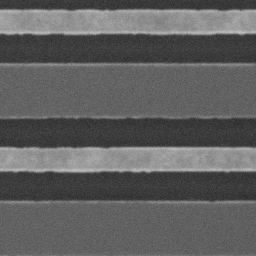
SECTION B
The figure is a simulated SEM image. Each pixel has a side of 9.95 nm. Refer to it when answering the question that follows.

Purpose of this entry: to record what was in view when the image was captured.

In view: lines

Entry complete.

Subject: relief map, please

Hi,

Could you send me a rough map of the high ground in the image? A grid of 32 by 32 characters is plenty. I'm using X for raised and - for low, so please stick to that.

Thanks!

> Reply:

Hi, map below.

--------------------------------
XXXXXXXXXXXXXXXXXXXXXXXXXXXXXXXX
XXXXXXXXXXXXXXXXXXXXXXXXXXXXXXXX
XXXXXXXXXXXXXXXXXXXXXXXXXXXXXXXX
--------------------------------
--------------------------------
--------------------------------
--------------------------------
XXXXXXXXXXXXXXXXXXXXXXXXXXXXXXXX
XXXXXXXXXXXXXXXXXXXXXXXXXXXXXXXX
XXXXXXXXXXXXXXXXXXXXXXXXXXXXXXXX
XXXXXXXXXXXXXXXXXXXXXXXXXXXXXXXX
XXXXXXXXXXXXXXXXXXXXXXXXXXXXXXXX
XXXXXXXXXXXXXXXXXXXXXXXXXXXXXXXX
XXXXXXXXXXXXXXXXXXXXXXXXXXXXXXXX
--------------------------------
--------------------------------
--------------------------------
XX--X-----XXX--XXXXXXXXXXXXXXXXX
XXXXXXXXXXXXXXXXXXXXXXXXXXXXXXXX
XXXXXXXXXXXXXXXXXXXXXXXXXXXXXXXX
--------------------------------
--------------------------------
--------------------------------
--------------------------------
XXXXXXXXXXXXXXXXXXXXXXXXXXXXXXXX
XXXXXXXXXXXXXXXXXXXXXXXXXXXXXXXX
XXXXXXXXXXXXXXXXXXXXXXXXXXXXXXXX
XXXXXXXXXXXXXXXXXXXXXXXXXXXXXXXX
XXXXXXXXXXXXXXXXXXXXXXXXXXXXXXXX
XXXXXXXXXXXXXXXXXXXXXXXXXXXXXXXX
XXXXXXXXXXXXXXXXXXXXXXXXXXXXXXXX